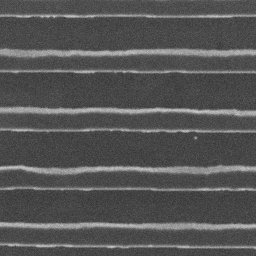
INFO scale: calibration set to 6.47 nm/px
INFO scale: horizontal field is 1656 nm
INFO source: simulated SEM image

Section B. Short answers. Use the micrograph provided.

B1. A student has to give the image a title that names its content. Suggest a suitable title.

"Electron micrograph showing lines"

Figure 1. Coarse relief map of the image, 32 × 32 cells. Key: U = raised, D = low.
UUUUUUUUUUUUUUUUUUUUUUUUUUUUUUUU
UUUUUUUUUUUUUUUUUUUUUUUUUUUUUUUU
DDDDDDDDDDDDDDDDDDDDDDDDDDDDDDDD
DDDDDDDDDDDDDDDDDDDDDDDDDDDDDDDD
DDDDDDDDDDDDDDDDDDDDDDDDDDDDDDDD
DDDDDDDDDDDDDDDDDDDDDDDDDDDDDDDD
DDDDDDDDDDDDDDDDUUUUUUUUDDDDDDDD
UUUUUUUUUUUUUUUUUUUUUUUUUUUUUUUU
UUUUUUUUUUUUUUUUUUUUUUUUUUUUUUUU
DDDDDDDDDDDDDDDDDDDDDDDDDDDDDDDD
DDDDDDDDDDDDDDDDDDDDDDDDDDDDDDDD
DDDDDDDDDDDDDDDDDDDDDDDDDDDDDDDD
DDDDDDDDDDDDDDDDDDDDDDDDDDDDDDDD
DDDDDDDDDDDDDDDDDDDDDDDDDDDDDDDD
UUUUUUUUUUUUUUUUUUUUUUUUUUUUUUUU
UUUUUUUUUUUUUUUUUUUUUUUUUUUUUUUU
DDDDDDDDDDDDDDDDDDDDDDDDDDDDDDDD
DDDDDDDDDDDDDDDDDDDDDDDDDDDDDDDD
DDDDDDDDDDDDDDDDDDDDDDDDDDDDDDDD
DDDDDDDDDDDDDDDDDDDDDDDDDDDDDDDD
DDDDDDDDDDDDDDDDDDDDDDDDDDDDDDDD
UUUUUUUUUUUUUUUUUUUUUUUUUUUUUUUU
UUUUUUUUUUUUUUUUUUUUUUUUUUUUUUUU
UUUUUUUUUUUUUUUUUUUUUUUUUUUUUUUU
DDDDDDDDDDDDDDDDDDDDDDDDDDDDDDDD
DDDDDDDDDDDDDDDDDDDDDDDDDDDDDDDD
DDDDDDDDDDDDDDDDDDDDDDDDDDDDDDDD
DDDDDDDDDDDDDDDDDDDDDDDDDDDDDDDD
UUUUUUUUUUUUUUUUUUUUUUUUUUUUUUUU
UUUUUUUUUUUUUUUUUUUUUUUUUUUUUUUU
UUUUUUUUUUUUUUUUUUUUUUUUUUUUUUUU
DDDDDDDDDDDDDDDDDDDDDDDDDDDDDDDD